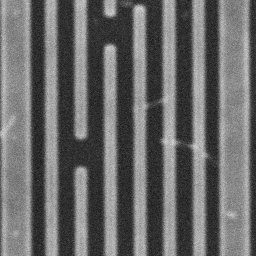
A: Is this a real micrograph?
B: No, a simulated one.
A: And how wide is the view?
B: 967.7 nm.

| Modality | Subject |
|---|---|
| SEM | groups of lines, slits or small figures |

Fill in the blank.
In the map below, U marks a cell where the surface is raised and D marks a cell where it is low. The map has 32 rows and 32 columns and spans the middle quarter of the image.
DDDUUDDDDDUUUDDDDDUUDDDDDUUUDDDD
DDDUUDDDDDUUUDDDDDUUDDDDDUUUDDDD
DDDUUDDDDDUUUDDDDDUUDDDDDUUUDDDD
DDDUUDDDDDUUUDDDDDUUDDDDDUUUDDDD
DDDUUDDDDDUUUDDDDDUUDDDDDUUUDDDD
DDDUUDDDDDUUUDDDDDUUDDDDDUUUDDDD
DDDUUDDDDDUUUDDDDDUUDDDDDUUUDDDD
DDDUUDDDDDUUUDDDDDUUDDDDDUUUDDDD
DDDUUDDDDDUUUDDDDDUUDDDDDUUUDDDD
DDDUUDDDDDUUUDDDDDUUDDDDDUUUDDDD
DDDUUDDDDDUUUDDDDDUUUDDDDUUUDDDD
DDDUUDDDDDUUUDDDDUUUDDDDDUUUDDDD
DDDUUDDDDDUUUDDDDDUUDDDDDUUUDDDD
DDDUUDDDDDUUUDDDDDUUDDDDDUUUDDDD
DDDUUDDDDDUUUDDDDDUUDDDDDUUUDDDD
DDDUUDDDDDUUUDDDDDUUDDDDDUUUDDDD
DDDUUDDDDDUUUDDDDDUUDDDDDUUUDDDD
DDDUUDDDDDUUUDDDDDUUDDDDDUUUDDDD
DDDUUDDDDDUUUDDDDDUUDDDDDUUUDDDD
DDDDDDDDDDUUUDDDDDUUDDDDDUUUDDDD
DDDDDDDDDDUUUDDDDDUUDDDDDUUUDDDD
DDDDDDDDDDUUUDDDDDUUDDDDDUUUDDDD
DDDDDDDDDDUUUDDDDDUUDDDDDUUUDDDD
DDDDDDDDDDUUUDDDDDUUDDDDDUUUDDDD
DDDDDDDDDDUUUDDDDDUUDDDDDUUUDDDD
DDDDDDDDDDUUUDDDDDUUDDDDDUUUDDDD
DDDUUDDDDDUUUDDDDDUUDDDDDUUUDDDD
DDDUUDDDDDUUUDDDDDUUDDDDDUUUDDDD
DDDUUDDDDDUUUDDDDDUUDDDDDUUUDDDD
DDDUUDDDDDUUUDDDDDUUDDDDDUUUDDDD
DDDUUDDDDDUUUDDDDDUUDDDDDUUUDDDD
DDDUUDDDDDUUUDDDDDUUDDDDDUUUDDDD